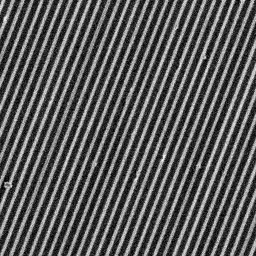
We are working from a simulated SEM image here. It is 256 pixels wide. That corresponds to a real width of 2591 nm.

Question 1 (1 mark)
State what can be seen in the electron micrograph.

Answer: parallel lines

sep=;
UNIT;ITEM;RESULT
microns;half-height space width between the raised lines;0.065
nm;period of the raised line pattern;90.5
